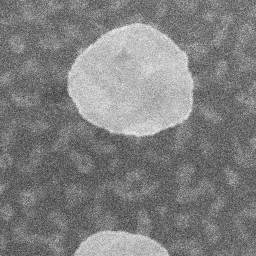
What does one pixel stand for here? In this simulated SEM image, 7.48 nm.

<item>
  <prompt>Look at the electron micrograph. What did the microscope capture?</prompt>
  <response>raised bodies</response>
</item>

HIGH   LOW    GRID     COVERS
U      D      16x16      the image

DDDDDDDDDDDDDDDD
DDDDDDDDDDDDDDDD
DDDDDDUUUUUDDDDD
DDDDDUUUUUUUDDDD
DDDDUUUUUUUUDDDD
DDDDUUUUUUUUDDDD
DDDDDUUUUUUUDDDD
DDDDDDUUUUUDDDDD
DDDDDDDDDDDDDDDD
DDDDDDDDDDDDDDDD
DDDDDDDDDDDDDDDD
DDDDDDDDDDDDDDDD
DDDDDDDDDDDDDDDD
DDDDDDDDDDDDDDDD
DDDDDDUDDDDDDDDD
DDDDDUUUUUDDDDDD